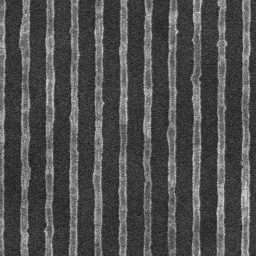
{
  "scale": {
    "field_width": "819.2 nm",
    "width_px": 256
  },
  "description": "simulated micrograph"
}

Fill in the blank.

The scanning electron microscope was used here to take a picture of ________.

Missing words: parallel lines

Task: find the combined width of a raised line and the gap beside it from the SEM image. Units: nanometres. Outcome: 78.3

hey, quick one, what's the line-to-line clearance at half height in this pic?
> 57.1 nanometers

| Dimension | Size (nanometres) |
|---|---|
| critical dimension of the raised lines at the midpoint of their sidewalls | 21.6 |